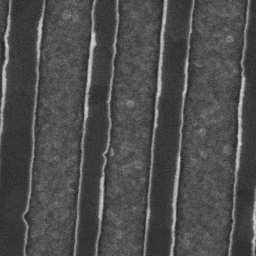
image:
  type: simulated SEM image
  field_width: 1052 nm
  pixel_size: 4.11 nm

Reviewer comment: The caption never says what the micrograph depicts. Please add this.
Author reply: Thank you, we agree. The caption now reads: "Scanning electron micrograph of one or a few lines or trenches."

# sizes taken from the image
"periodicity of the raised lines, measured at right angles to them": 304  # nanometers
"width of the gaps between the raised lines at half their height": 202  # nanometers